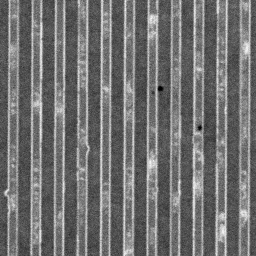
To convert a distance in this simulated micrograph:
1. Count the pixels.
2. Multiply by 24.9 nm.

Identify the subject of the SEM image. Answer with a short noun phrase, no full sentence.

parallel lines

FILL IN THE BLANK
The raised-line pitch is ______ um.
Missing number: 0.577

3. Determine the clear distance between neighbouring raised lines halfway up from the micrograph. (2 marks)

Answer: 0.358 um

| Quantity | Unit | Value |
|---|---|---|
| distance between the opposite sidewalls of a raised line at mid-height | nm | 215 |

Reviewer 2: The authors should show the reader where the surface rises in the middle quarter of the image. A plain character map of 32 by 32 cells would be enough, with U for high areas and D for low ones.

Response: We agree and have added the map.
DDDDUUDDDUUUDDDUUDDDDUUDDDDUUDDD
DDDDUUDDDUUUDDDUUDDDDUUDDDDUUDDD
DDDDUUDDDUUUDDDUUDDDDUUDDDDUUDDD
DDDDUUDDDUUUDDDUUDDDDUUDDDDUUDDD
DDDDUUDDDUUDDDDUUDDDDUUDDDDUUDDD
DDDDUUDDDUUDDDDUUDDDDUUDDDDUUDDD
DDDDUUDDDUUDDDDUUDDDDUUDDDDUUDDD
DDDDUUDDDUUDDDDUUDDDDUUDDDDUUDDD
DDDDUUDDDUUDDDDUUDDDDUUDDDDUUDDD
DDDDUUDDDUUDDDDUUDDDDUUDDDDUUDDD
DDDDUUDDDUUDDDDUUDDDDUUDDDDUUDDD
DDDDUUDDDUUDDDDUUDDDDUUDDDDUUDDD
DDDDUUDDDUUDDDDUUDDDDUUDDDDUUDDD
DDDDUUDDDUUDDDDUUDDDDUUDDDDUUDDD
DDDDUUDDDUUDDDDUUDDDDUUDDDDUUDDD
DDDDUUDDDUUDDDDUUDDDDUUDDDDUUDDD
DDDDUUDDDUUDDDDUUDDDDUUDDDDUUDDD
DDDDUUDDDUUDDDDUUDDDDUUDDDDUUDDD
DDDDUUDDDUUDDDDUUDDDDUUDDDDUUDDD
DDDDUUDDDUUDDDDUUDDDDUUDDDDUUDDD
DDDDUUDDDUUDDDDUUDDDDUUDDDDUUDDD
DDDDUUDDDUUDDDDUUDDDDUUDDDDUUDDD
DDDDUUDDDUUDDDDUUDDDDUUDDDDUUDDD
DDDDUUDDDUUDDDDUUDDDDUUDDDDUUDDD
DDDDUUDDDUUDDDDUUDDDDUUDDDDUUDDD
DDDDUUDDDUUDDDDUUDDDDUUDDDDUUDDD
DDDDUUDDDUUDDDDUUDDDDUUDDDDUUDDD
DDDDUUDDDUUDDDDUUDDDDUUDDDDUUDDD
DDDDUUDDDUUDDDDUUDDDDUUDDDDUUDDD
DDDDUUDDDUUDDDDUUDDDDUUDDDDUUDDD
DDDDUUDDDUUDDDDUUDDDDUUDDDDUUDDD
DDDDUUDDDUUDDDDUUDDDDUUDDDDUUDDD